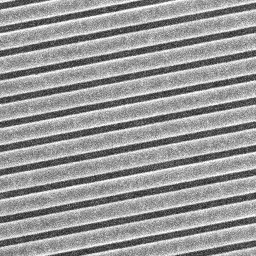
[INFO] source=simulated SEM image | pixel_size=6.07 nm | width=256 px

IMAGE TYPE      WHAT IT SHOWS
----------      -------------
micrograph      parallel lines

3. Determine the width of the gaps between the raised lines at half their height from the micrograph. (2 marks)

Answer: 0.0477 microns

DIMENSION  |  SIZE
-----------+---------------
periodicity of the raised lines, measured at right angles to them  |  142 nm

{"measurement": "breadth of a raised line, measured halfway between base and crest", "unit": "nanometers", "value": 96.2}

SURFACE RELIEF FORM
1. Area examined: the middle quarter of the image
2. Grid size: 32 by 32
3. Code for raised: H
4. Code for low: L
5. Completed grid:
LLLLLHHHHHHHHHHHHHHHHHHHHHLLLLLL
HHHHHHHHHHHHHHHHHHHHHLLLLLLLLLLH
HHHHHHHHHHHHHHHLLLLLLLLLLHHHHHHH
HHHHHHHHHHLLLLLLLLLLHHHHHHHHHHHH
HHHHHLLLLLLLLLLHHHHHHHHHHHHHHHHH
LLLLLLLLLHHHHHHHHHHHHHHHHHHHHHLL
LLLLHHHHHHHHHHHHHHHHHHHHHLLLLLLL
HHHHHHHHHHHHHHHHHHHLLLLLLLLLLLLH
HHHHHHHHHHHHHHHLLLLLLLLLLHHHHHHH
HHHHHHHHHLLLLLLLLLLLHHHHHHHHHHHH
HHHLLLLLLLLLLLLHHHHHHHHHHHHHHHHH
LLLLLLLLLHHHHHHHHHHHHHHHHHHHHHLL
LLLLHHHHHHHHHHHHHHHHHHHHHLLLLLLL
HHHHHHHHHHHHHHHHHHHHLLLLLLLLLLLH
HHHHHHHHHHHHHHLLLLLLLLLLLLHHHHHH
HHHHHHHHHLLLLLLLLLLLHHHHHHHHHHHH
HHHHLLLLLLLLLLLHHHHHHHHHHHHHHHHH
LLLLLLLLLLHHHHHHHHHHHHHHHHHHHHLL
LLLLHHHHHHHHHHHHHHHHHHHHHLLLLLLL
HHHHHHHHHHHHHHHHHHHHLLLLLLLLLLHH
HHHHHHHHHHHHHHLLLLLLLLLLHHHHHHHH
HHHHHHHHHLLLLLLLLLLHHHHHHHHHHHHH
HHHHLLLLLLLLLLHHHHHHHHHHHHHHHHHH
LLLLLLLLHHHHHHHHHHHHHHHHHHHHHLLL
LLLHHHHHHHHHHHHHHHHHHHHHLLLLLLLL
HHHHHHHHHHHHHHHHHHHLLLLLLLLLLLHH
HHHHHHHHHHHHHHLLLLLLLLLLLHHHHHHH
HHHHHHHHHLLLLLLLLLLHHHHHHHHHHHHH
HHHLLLLLLLLLLLHHHHHHHHHHHHHHHHHH
LLLLLLLLLHHHHHHHHHHHHHHHHHHHHLLL
LLLHHHHHHHHHHHHHHHHHHHHHLLLLLLLL
HHHHHHHHHHHHHHHHHHHLLLLLLLLLLLHH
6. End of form